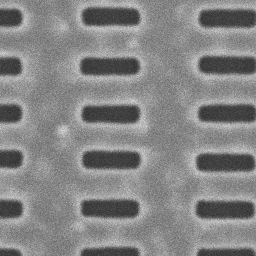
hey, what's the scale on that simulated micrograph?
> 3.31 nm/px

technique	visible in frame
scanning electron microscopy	holes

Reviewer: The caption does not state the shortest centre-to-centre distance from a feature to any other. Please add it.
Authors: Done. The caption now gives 156 nanometers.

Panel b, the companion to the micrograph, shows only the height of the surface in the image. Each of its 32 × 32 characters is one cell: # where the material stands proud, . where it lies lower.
################################
...#######.......########.......
...#######........#######.......
..#########################.....
################################
################################
################################
...#######.......########.......
...#######........#######.......
..#########.....################
################################
################################
################################
...#######.......########.......
...#######........#######.......
################################
################################
################################
################################
...#######........#######.......
...#######........######........
#########################....###
################################
################################
################################
...#######.......########.......
...#######........######........
################################
################################
################################
################################
...#######.......########.......